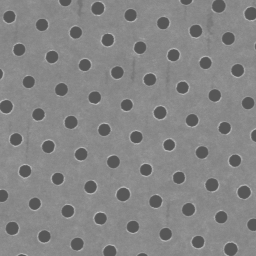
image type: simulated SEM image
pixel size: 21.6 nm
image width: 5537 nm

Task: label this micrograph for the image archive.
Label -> a regular array of holes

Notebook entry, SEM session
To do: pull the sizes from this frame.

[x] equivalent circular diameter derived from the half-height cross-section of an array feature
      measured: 265 nm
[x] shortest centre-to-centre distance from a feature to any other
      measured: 718 nanometers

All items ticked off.